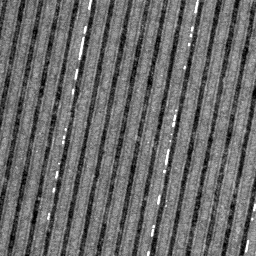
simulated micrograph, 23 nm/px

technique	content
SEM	parallel lines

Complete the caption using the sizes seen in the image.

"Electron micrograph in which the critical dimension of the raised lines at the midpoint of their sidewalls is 155 nanometers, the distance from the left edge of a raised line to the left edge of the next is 402 nm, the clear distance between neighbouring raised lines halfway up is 0.251 microns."